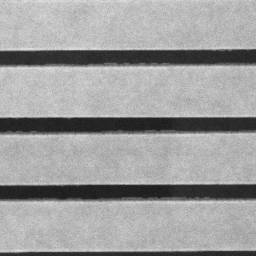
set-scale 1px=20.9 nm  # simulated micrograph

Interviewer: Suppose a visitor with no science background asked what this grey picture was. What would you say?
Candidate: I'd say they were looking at lines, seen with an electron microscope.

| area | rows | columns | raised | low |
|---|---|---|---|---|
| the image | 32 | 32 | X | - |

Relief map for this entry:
XXXXXXXXXXXXXXXXXXXXXXXXXXXXXXXX
XXXXXXXXXXXXXXXXXXXXXXXXXXXXXXXX
XXXXXXXXXXXXXXXXXXXXXXXXXXXXXXXX
XXXXXXXXXXXXXXXXXXXXXXXXXXXXXXXX
XXXXXXXXXXXXXXXXXXXXXXXXXXXXXXXX
XXXXXXXXXXXXXXXXXXXXXXXXXXXXXXXX
--------------------------------
--------------------------------
XXXXXXXXXXXXXXXXXXXXXXXXXXXXXXXX
XXXXXXXXXXXXXXXXXXXXXXXXXXXXXXXX
XXXXXXXXXXXXXXXXXXXXXXXXXXXXXXXX
XXXXXXXXXXXXXXXXXXXXXXXXXXXXXXXX
XXXXXXXXXXXXXXXXXXXXXXXXXXXXXXXX
XXXXXXXXXXXXXXXXXXXXXXXXXXXXXXXX
XXXXXXXXXXXXXXXXXXXXXXXXXXXXXXXX
--------------------------------
--------------------------------
XXXXXXXXXXXXXXXXXXXXXXXXXXXXXXXX
XXXXXXXXXXXXXXXXXXXXXXXXXXXXXXXX
XXXXXXXXXXXXXXXXXXXXXXXXXXXXXXXX
XXXXXXXXXXXXXXXXXXXXXXXXXXXXXXXX
XXXXXXXXXXXXXXXXXXXXXXXXXXXXXXXX
XXXXXXXXXXXXXXXXXXXXXXXXXXXXXXXX
--------------------------------
--------------------------------
XXXXXXXXXXXXXXXXXXXXXXXXXXXXXXXX
XXXXXXXXXXXXXXXXXXXXXXXXXXXXXXXX
XXXXXXXXXXXXXXXXXXXXXXXXXXXXXXXX
XXXXXXXXXXXXXXXXXXXXXXXXXXXXXXXX
XXXXXXXXXXXXXXXXXXXXXXXXXXXXXXXX
XXXXXXXXXXXXXXXXXXXXXXXXXXXXXXXX
XXX-----------------------------